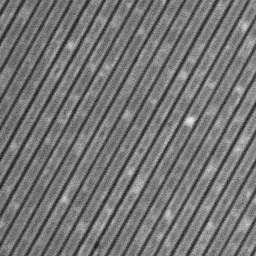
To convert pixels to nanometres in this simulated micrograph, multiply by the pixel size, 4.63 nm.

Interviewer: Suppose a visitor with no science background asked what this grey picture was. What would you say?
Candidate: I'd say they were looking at parallel lines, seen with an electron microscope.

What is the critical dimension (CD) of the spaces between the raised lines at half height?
0.0162 um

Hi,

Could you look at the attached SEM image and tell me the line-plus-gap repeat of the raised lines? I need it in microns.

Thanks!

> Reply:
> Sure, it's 0.0652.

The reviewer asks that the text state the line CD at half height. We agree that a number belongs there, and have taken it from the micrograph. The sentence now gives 0.0485 µm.